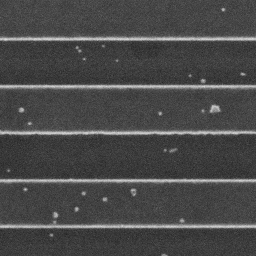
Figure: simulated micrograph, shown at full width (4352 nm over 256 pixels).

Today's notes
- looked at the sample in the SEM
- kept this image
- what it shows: lines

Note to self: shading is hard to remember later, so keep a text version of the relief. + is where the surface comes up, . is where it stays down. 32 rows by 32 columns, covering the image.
++++++++++++++++++++++++++++++++
++++++++++++++++++++++++++++++++
++++++++++++++++++++++++++++++++
++++++++++++++++++++++++++++++++
++++++++++++++++++++++++++++++++
................................
................................
................................
................................
................................
................................
++++++++++++++++++++++++++++++++
++++++++++++++++++++++++++++++++
++++++++++++++++++++++++++++++++
++++++++++++++++++++++++++++++++
++++++++++++++++++++++++++++++++
++++++++++++++++++++++++++++++++
................................
................................
................................
................................
................................
................................
++++++++++++++++++++++++++++++++
++++++++++++++++++++++++++++++++
++++++++++++++++++++++++++++++++
++++++++++++++++++++++++++++++++
++++++++++++++++++++++++++++++++
................................
................................
................................
................................